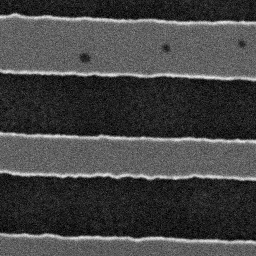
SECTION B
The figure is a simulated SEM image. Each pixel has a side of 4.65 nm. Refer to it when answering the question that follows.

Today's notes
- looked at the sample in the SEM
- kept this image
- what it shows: lines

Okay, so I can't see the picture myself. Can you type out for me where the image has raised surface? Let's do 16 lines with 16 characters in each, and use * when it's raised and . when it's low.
................
****************
****************
****************
****************
................
................
................
****............
****************
****************
................
................
................
................
****************